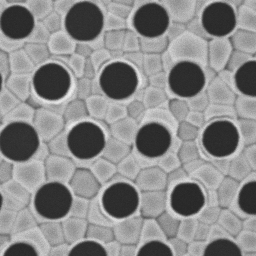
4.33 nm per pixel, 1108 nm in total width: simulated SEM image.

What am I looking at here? a regular array of holes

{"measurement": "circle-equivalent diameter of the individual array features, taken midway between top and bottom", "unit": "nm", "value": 156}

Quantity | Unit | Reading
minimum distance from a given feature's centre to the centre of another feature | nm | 290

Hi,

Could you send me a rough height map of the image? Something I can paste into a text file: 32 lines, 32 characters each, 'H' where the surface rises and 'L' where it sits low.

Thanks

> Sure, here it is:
HHHHHHHHHLLLHHHHHHLLHHHHHHLLHHHH
LLLLHHHHHLLLLHHHHLLLLHHHHLLLLHHH
LLLLHHHHLLLLLHHHHLLLLHHHHLLLLHHH
LLLLHHHHLLLLLHHHHLLLLHHHHHLLLHHH
HLLHHHHHHLLLHHHHHHLLHHHHHHHLHHHH
HHHHHHHHHHHHHHHHHHHHHHHHHHHHHHHH
HHHHHHHHHHHHHHHHHHHHHHHHHHHHHHHH
HHHHHHHHHHHHHHHHHHHHHHHHHHHHHHHH
HHHHHLLLHHHHHLLLLHHHHHLLLHHHHHLL
HHHHLLLLLHHHHLLLLHHHHLLLLHHHHLLL
HHHHLLLLLHHHLLLLLHHHHLLLLHHHHLLL
HHHHHLLLHHHHHLLLLHHHHHLLLHHHHHLL
HHHHHHLHHHHHHHHHHHHHHHHHHHHHHHHH
HHHHHHHHHHHHHHHHHHHHHHHHHHHHHHHH
HHHHHHHHHHHHHHHHHHHHHHHHHHHHHHHH
HLLHHHHHHHLLHHHHHHHLHHHHHHLLLHHH
LLLLLHHHHLLLLHHHHLLLLHHHHLLLLLHH
LLLLLHHHLLLLLHHHHLLLLHHHHLLLLLHH
LLLLLHHHHLLLLHHHHLLLLHHHHHLLLLHH
HLLLHHHHHLLLHHHHHHLLHHHHHHHLHHHH
HHHHHHHHHHHHHHHHHHHHHHHHHHHHHHHH
HHHHHHHHHHHHHHHHHHHHHHHHHHHHHHHH
HHHHHHHHHHHHHHHHHHHHHHHHHHHHHHHH
HHHHHLLLHHHHHHLLLHHHHHLLLHHHHHLL
HHHHHLLLLHHHHLLLLHHHHLLLLHHHHHLL
HHHHLLLLLHHHHLLLLHHHHLLLLHHHHHLL
HHHHHLLLHHHHHLLLLHHHHHLLLHHHHHHL
HHHHHHHHHHHHHHHHHHHHHHHHHHHHHHHH
HHHHHHHHHHHHHHHHHHHHHHHHHHHHHHHH
HHHHHHHHHHHHHHHHHHHHHHHHHHHHHHHH
HHLHHHHHHHLLHHHHHHLLLHHHHHLLLHHH
HLLLHHHHHLLLLHHHHLLLLHHHHHLLLLHH